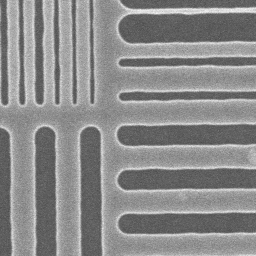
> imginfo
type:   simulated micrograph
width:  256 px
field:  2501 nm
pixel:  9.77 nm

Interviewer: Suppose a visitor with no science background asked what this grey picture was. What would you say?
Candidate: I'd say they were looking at groups of lines, slits or small figures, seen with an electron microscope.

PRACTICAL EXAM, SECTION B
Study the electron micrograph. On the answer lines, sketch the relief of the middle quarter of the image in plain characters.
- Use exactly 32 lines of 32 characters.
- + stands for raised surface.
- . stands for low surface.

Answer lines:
++.+++..++++++..................
++.+++..++++++++++++++++++++++++
++.+++..++++++++++++++++++++++++
++.+++..++++++++++++++++++++++++
++.+++..++++++++++++++++++++++++
++.+++..++++++++++++++++++++++++
++.+++..++++++++++++++++++++++++
++.+++..++++++..................
++.+++..++++++..................
++.+++..+++++++.++++++++++++++++
++++++++++++++++++++++++++++++++
++++++++++++++++++++++++++++++++
++++++++++++++++++++++++++++++++
++++++++++++++++++++++++++++++++
++++++++++++++++++++++++++++++++
++++++.+++++++..................
++++.....++++...................
++++.....++++...................
++++.....++++...................
++++.....+++++..................
++++.....++++++.................
++++.....+++++++++++++++++++++++
++++.....+++++++++++++++++++++++
++++.....+++++++++++++++++++++++
++++.....+++++++++++++++++++++++
++++.....+++++++++++++++++++++++
++++.....++++++.................
++++.....+++++..................
++++.....++++...................
++++.....++++...................
++++.....+++++..................
++++.....++++++..............+++